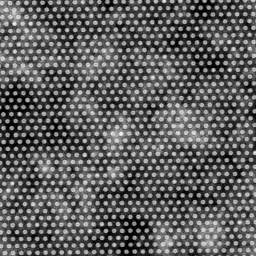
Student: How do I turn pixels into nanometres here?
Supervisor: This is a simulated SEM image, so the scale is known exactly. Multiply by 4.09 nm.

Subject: a regular array of raised bodies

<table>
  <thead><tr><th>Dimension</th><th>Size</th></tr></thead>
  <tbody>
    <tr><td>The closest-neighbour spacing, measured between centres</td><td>0.0321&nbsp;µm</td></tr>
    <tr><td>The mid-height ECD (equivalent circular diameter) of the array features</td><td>16.6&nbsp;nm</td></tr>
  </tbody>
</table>